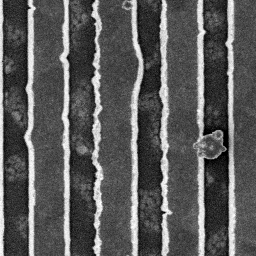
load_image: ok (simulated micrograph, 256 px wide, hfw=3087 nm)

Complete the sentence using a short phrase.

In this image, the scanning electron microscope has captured one or a few lines or trenches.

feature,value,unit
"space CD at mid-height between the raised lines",366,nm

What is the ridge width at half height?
443 nanometers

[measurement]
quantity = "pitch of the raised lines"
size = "813 nanometres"